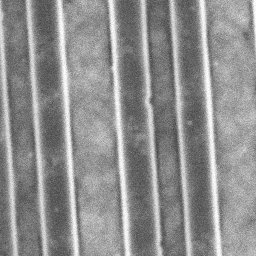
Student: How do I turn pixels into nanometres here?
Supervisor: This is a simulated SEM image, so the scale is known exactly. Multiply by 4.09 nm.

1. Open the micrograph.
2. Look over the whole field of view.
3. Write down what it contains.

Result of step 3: one or a few lines or trenches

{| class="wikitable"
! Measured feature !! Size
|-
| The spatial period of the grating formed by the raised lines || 0.292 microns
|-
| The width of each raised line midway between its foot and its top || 32.3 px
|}